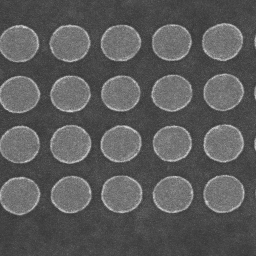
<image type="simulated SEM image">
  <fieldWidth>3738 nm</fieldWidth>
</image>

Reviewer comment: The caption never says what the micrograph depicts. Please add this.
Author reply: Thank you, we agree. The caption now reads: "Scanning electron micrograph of a regular array of raised bodies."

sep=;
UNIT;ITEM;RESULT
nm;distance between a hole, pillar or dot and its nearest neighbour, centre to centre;736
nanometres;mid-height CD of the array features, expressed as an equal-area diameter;555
